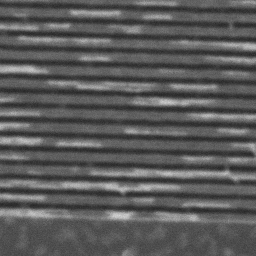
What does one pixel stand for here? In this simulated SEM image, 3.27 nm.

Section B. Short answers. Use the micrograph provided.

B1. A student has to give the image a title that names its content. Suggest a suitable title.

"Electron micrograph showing parallel lines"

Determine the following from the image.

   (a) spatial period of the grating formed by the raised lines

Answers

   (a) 46.8 nm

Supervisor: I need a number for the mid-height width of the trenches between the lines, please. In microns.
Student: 0.0233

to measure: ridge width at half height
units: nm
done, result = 23.7